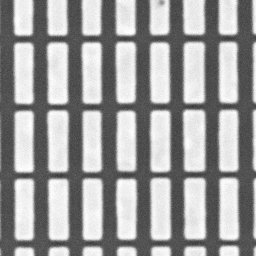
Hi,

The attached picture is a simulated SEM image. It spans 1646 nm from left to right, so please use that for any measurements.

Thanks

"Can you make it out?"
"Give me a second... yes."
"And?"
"wiring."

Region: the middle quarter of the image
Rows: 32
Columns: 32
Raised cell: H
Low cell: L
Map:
HLLLLHHHHLLLLHHHHHLLLLHHHHLLLLHH
HLLLLHHHHLLLLHHHHHLLLLHHHHLLLLHH
HLLLLHHHHLLLLHHHHHLLLLHHHHLLLLHH
HLLLLHHHHLLLLHHHHHLLLLHHHHLLLLHH
HLLLLHHHHLLLLHHHHHLLLLHHHHLLLLHH
HLLLLHHHHLLLLHHHHHLLLLHHHHLLLLHH
HLLLLHHHHLLLLHHHHLLLLLHHHHLLLLHH
HLLLLHHHHLLLLHHHHLLLLLHHHHLLLLHH
HLLLLHHHHLLLLLHHHLLLLLHHHHLLLLHH
HLLLLHHHHLLLLLHHHLLLLLHHHHLLLLLH
LLLLLLLLLLLLLLLLLLLLLLLLLLLLLLLL
LLLLLLLLLLLLLLLLLLLLLLLLLLLLLLLL
HLLLLHHHHLLLLLHHHLLLLLHHHHLLLLHH
HLLLLHHHHLLLLLHHHLLLLLHHHHLLLLHH
HLLLLHHHHLLLLLHHHHLLLLHHHHLLLLHH
HLLLLHHHHLLLLLHHHHLLLLHHHHLLLLHH
HLLLLHHHHLLLLLHHHHLLLLHHHHLLLLHH
HLLLLHHHHLLLLLHHHHLLLLHHHHLLLLHH
HLLLLHHHHLLLLLHHHHLLLLHHHHLLLLHH
HLLLLHHHHLLLLLHHHHLLLLHHHHLLLLHH
HLLLLHHHHLLLLLHHHHLLLLHHHHLLLLHH
HLLLLHHHHLLLLLHHHHLLLLHHHHLLLLHH
HLLLLHHHHLLLLLHHHHLLLLHHHHLLLLHH
HLLLLHHHHLLLLLHHHHLLLLHHHHLLLLHH
HLLLLHHHHLLLLLHHHHLLLLHHHHLLLLHH
HLLLLHHHHLLLLLHHHHLLLLHHHHLLLLHH
HLLLLHHHHLLLLLHHHLLLLLHHHHLLLLLH
LLLLLLLLLLLLLLLLLLLLLLLLLLLLLLLL
LLLLLLLLLLLLLLLLLLLLLLLLLLLLLLLL
HLLLLHHHHLLLLLHHHHLLLLHHHHLLLLHH
HLLLLHHHHLLLLLHHHHLLLLHHHHLLLLHH
HLLLLHHHHLLLLHHHHHLLLLHHHHLLLLHH